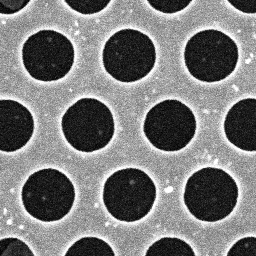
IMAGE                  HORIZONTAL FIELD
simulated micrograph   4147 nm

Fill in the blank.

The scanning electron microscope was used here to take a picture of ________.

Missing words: a regular array of holes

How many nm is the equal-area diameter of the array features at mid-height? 876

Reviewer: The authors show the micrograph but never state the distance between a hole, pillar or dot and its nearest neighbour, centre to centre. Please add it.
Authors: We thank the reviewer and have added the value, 80.2 px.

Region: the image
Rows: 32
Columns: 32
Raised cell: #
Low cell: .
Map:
....####......#####.....#####...
..#######...########..########..
################################
################################
####....######....######.....###
###......####......####.......##
###......####......####.......##
###......####......####.......##
###......####......####......###
####....######....######.....###
################################
################################
.#########..########..########..
...######.....#####.....#####...
....####......####......####....
....####......####.......###....
....####......####.......###....
....####......#####.....#####...
...######....#######...#######..
################################
################################
####....######....######....####
###......####......####......###
###......####.......###.......##
###......####.......###.......##
###......####......####.......##
###......#####.....#####.....###
#####...#######..########...####
################################
###########.####################
...######.....#####.....#####...
....####......####......####....